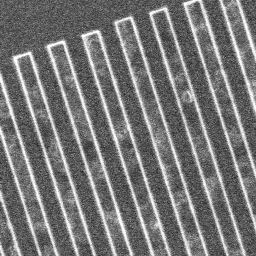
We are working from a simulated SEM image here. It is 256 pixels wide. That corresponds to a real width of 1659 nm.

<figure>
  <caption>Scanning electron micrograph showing parallel lines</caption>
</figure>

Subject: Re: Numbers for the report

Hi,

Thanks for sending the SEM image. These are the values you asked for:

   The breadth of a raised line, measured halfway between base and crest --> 105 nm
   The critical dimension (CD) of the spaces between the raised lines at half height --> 0.122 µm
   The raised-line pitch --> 230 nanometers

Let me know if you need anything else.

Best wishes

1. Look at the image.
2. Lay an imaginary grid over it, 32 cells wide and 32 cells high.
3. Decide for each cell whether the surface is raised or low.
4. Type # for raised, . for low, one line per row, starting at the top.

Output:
.......................##...##..
...................##..##...##..
...............#...##...##..##..
...............##..###..##...##.
...........#...##...##..##...##.
.......#...##..##...##...##..##.
......##...##...##..##...##...##
..##...##..##...##...##..##...##
..##...##...##..##...##...##..##
...##..##...##...##..##...##...#
...##...##..##...##...##..##...#
#..##...##...##..##...##...##..#
#..###..##...##..###..##...##...
#...##...##..##...##..###..##...
##..##...##...##..##...##...##..
##..###..##...##..###..##...##..
##...##..###..##...##..###..##..
###..##...##..###..##...##..###.
.##..###..##...##..###..##...##.
.##...##..###..##...##..###..##.
.##...##...##..###..##...##..###
..##..##...##...##..###..##...##
..##...##..##...##...##..###..##
..##...##...##..###..##...##..##
...##..##...##...##..###..##...#
...##...##..##...##...##..###..#
#..##...##...##..##...##...##..#
#...##..##...##...##..##...##...
#...##...##..##...##...##..###..
##..##...##...##..##...##...##..
##...##..##...##...##..##...##..
##...##...##..##...##...##..##..